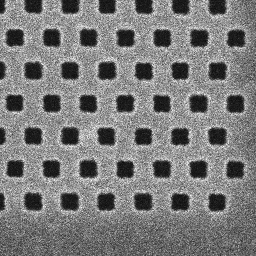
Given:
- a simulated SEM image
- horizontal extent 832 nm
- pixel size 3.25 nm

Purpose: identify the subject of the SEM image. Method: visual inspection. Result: a regular array of holes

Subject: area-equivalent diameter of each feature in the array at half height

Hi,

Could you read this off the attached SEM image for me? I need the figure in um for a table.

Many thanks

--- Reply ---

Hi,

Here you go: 0.0595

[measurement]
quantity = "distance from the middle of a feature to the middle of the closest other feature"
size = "0.119 microns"